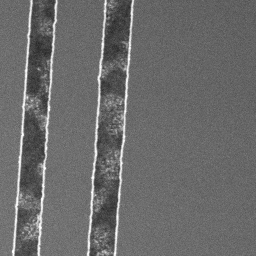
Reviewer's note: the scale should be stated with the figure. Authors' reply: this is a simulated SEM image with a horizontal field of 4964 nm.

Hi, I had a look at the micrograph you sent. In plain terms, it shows one or a few lines or trenches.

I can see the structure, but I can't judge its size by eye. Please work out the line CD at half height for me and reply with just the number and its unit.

488 nm